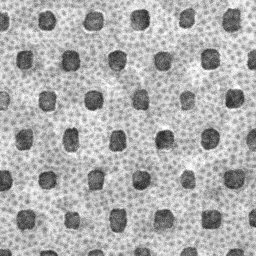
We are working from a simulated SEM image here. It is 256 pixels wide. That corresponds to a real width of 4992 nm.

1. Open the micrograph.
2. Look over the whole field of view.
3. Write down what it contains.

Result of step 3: a regular array of holes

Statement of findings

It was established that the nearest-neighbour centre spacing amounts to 45 pixels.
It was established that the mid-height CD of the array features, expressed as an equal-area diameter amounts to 421 nm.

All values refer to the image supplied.